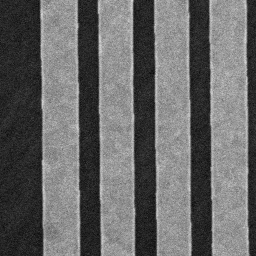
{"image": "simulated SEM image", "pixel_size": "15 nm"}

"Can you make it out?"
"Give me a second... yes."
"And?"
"wiring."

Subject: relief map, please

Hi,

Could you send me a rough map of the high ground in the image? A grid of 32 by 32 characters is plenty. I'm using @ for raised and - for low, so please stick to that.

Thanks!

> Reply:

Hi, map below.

-----@@@@@--@@@@---@@@@---@@@@@-
-----@@@@@--@@@@---@@@@---@@@@@-
-----@@@@@--@@@@---@@@@---@@@@@-
-----@@@@@--@@@@---@@@@---@@@@@-
-----@@@@@--@@@@---@@@@---@@@@@-
-----@@@@@---@@@---@@@@---@@@@@-
-----@@@@@---@@@---@@@@---@@@@@-
-----@@@@@---@@@----@@@---@@@@@-
-----@@@@@---@@@----@@@---@@@@@-
-----@@@@@---@@@----@@@---@@@@@-
-----@@@@@---@@@----@@@@--@@@@@-
-----@@@@@---@@@@---@@@@--@@@@@-
-----@@@@@---@@@@---@@@@--@@@@@-
-----@@@@@---@@@@---@@@@--@@@@@-
-----@@@@@---@@@@---@@@@--@@@@@-
-----@@@@@---@@@@---@@@@--@@@@@-
-----@@@@@---@@@@---@@@@--@@@@@-
-----@@@@@---@@@@---@@@@--@@@@@-
-----@@@@@---@@@@---@@@@--@@@@@-
-----@@@@@---@@@@---@@@@--@@@@@-
-----@@@@@---@@@@---@@@@--@@@@@-
-----@@@@@---@@@@---@@@@--@@@@@-
-----@@@@@---@@@@---@@@@--@@@@@-
------@@@@---@@@@---@@@@---@@@@-
------@@@@---@@@@---@@@@---@@@@-
------@@@@---@@@@---@@@@---@@@@-
------@@@@---@@@@---@@@@---@@@@-
------@@@@---@@@@---@@@@---@@@@-
------@@@@---@@@@---@@@@---@@@@-
------@@@@---@@@@---@@@@---@@@@-
------@@@@---@@@@---@@@@---@@@@-
------@@@@---@@@@---@@@@---@@@@-